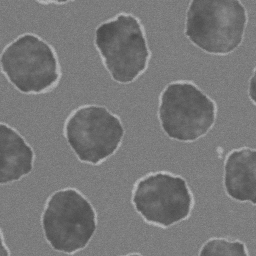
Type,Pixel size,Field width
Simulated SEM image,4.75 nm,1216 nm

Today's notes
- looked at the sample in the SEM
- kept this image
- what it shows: holes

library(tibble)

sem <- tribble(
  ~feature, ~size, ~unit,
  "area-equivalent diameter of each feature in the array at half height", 56.3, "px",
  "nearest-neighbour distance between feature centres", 429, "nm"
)